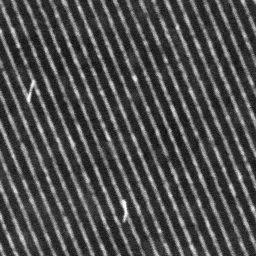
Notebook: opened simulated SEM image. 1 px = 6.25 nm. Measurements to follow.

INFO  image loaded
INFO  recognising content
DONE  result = parallel lines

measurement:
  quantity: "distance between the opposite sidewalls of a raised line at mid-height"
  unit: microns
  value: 0.0159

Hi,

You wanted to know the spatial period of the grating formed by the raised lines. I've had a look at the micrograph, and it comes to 73.9 nm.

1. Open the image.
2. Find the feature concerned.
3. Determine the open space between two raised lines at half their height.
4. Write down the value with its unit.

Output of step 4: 0.0578 micrometres